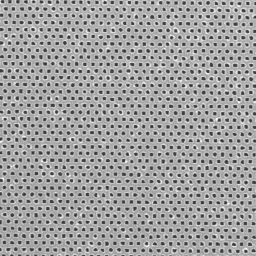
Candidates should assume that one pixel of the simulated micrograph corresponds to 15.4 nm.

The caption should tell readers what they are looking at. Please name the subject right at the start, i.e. a regular array of holes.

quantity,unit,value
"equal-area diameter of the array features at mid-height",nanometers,62.6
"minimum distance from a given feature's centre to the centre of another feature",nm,115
